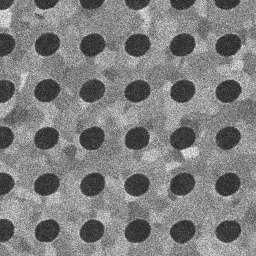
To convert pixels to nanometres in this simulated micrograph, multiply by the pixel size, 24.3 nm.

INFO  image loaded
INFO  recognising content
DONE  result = a regular array of holes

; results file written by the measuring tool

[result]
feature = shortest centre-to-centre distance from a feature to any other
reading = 1090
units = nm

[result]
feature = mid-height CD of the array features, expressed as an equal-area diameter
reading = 610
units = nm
